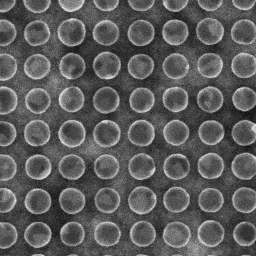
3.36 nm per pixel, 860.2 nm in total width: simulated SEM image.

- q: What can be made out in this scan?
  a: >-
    a regular array of raised bodies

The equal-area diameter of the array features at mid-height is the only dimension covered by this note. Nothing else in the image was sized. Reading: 86.3 nm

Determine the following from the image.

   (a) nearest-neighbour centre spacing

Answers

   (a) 0.112 micrometres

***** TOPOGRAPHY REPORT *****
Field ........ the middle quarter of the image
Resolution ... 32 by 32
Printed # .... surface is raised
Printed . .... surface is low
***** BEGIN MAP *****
#####..#######..######...######.
#####...######..######...######.
#####...#####....#####...#####..
.##......###......##.......##...
................................
................................
####.....###......###.....####..
#####...#####....#####...######.
#####...######...######..######.
#####...######...#####...######.
#####...#####....#####...#####..
####....#####....####.....####..
................................
................................
####.....###......###......##...
#####...#####....#####...######.
#####...######..######...######.
#####...######..#######..######.
#####...######..######...######.
#####...#####....#####....####..
.##......###....................
................................
................................
####.....####....#####....####..
#####...#####....#####...######.
#####...######..#######..######.
#####...######..#######..######.
#####...#####....#####....#####.
###......###......###......###..
................................
................................
###......####....#####....####..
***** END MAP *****